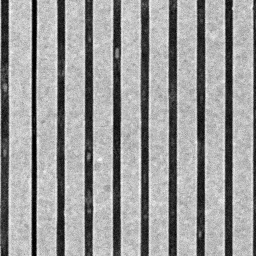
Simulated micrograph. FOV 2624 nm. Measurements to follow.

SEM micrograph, parallel lines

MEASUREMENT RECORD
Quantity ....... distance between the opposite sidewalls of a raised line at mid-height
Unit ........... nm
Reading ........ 196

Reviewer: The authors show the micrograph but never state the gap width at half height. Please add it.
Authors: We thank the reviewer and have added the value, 84.6 nm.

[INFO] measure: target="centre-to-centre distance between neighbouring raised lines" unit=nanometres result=285